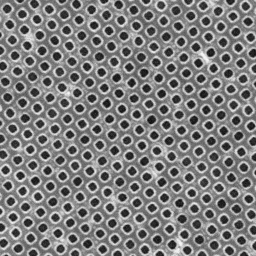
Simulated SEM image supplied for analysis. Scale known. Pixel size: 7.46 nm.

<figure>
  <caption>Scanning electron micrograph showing a regular array of holes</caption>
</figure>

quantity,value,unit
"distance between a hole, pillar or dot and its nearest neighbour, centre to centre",0.117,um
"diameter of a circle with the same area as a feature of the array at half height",74.9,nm